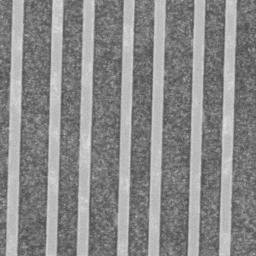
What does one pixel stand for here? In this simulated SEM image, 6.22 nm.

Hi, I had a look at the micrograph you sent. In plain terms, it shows parallel lines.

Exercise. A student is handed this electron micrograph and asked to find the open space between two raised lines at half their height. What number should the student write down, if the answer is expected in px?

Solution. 25.3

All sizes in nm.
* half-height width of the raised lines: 63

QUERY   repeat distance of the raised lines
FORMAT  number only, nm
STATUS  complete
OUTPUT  221